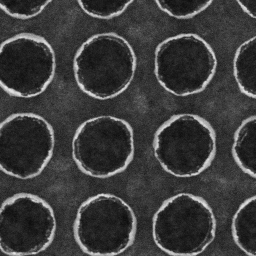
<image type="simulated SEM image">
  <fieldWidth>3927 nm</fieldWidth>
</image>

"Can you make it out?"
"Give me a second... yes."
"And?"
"raised bodies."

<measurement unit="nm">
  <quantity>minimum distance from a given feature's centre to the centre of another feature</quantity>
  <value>1230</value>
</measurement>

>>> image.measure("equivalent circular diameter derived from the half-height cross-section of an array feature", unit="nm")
944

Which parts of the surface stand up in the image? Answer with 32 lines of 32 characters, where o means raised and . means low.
oooooo....oooooo....oooooo....oo
.oooo......oooo......oooo......o
................................
................................
..oo........ooo.......ooo.......
oooooo....oooooo....oooooo....oo
ooooooo...ooooooo..oooooooo...oo
ooooooo..oooooooo..oooooooo..ooo
ooooooo..oooooooo..oooooooo..ooo
ooooooo...ooooooo...ooooooo..ooo
oooooo....oooooo....oooooo....oo
.oooo......oooo......oooo.....oo
................................
................................
..ooo.................oo........
oooooo....oooooo.....ooooo....oo
ooooooo...ooooooo...ooooooo...oo
ooooooo..oooooooo...ooooooo..ooo
ooooooo..oooooooo..oooooooo..ooo
oooooo...ooooooo....ooooooo..ooo
oooooo....oooooo....oooooo....oo
.oooo......oooo......oooo......o
................................
................................
..oo........oo........oo........
oooooo.....ooooo.....ooooo....oo
ooooooo...ooooooo...oooooo....oo
ooooooo...ooooooo..oooooooo..ooo
ooooooo...ooooooo..oooooooo..ooo
ooooooo...ooooooo..oooooooo..ooo
oooooo....oooooo....oooooo....oo
ooooo......oooo......oooo......o